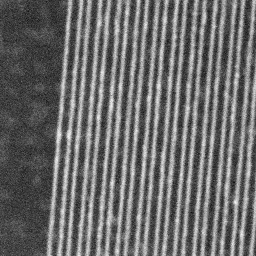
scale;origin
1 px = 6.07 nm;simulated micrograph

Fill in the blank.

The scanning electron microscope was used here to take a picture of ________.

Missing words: parallel lines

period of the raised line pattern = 0.0582 µm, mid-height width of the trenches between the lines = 0.0408 microns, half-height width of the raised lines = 17.4 nm